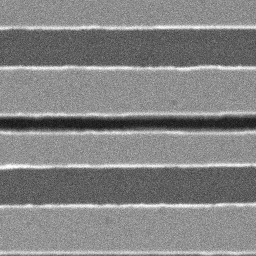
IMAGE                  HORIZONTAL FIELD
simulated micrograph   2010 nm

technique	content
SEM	lines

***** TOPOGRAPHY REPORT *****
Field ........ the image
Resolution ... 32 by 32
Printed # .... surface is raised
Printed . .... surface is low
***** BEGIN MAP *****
################################
################################
################################
#...............................
................................
................................
................................
................................
#####.##########........####.##.
################################
################################
################################
################################
################################
....#.......###.................
................................
..................##............
################################
################################
################################
################################
................................
................................
................................
................................
................................
################################
################################
################################
################################
################################
################################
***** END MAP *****